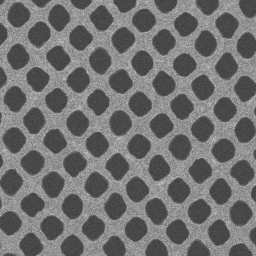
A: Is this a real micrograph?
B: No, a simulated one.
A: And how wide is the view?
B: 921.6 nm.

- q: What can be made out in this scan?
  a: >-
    a regular array of holes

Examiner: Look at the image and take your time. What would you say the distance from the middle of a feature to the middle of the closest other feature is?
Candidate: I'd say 104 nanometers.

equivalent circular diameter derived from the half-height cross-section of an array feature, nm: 82.2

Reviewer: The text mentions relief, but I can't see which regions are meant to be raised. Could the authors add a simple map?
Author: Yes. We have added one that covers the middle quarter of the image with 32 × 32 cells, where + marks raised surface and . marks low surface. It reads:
.++++++.....+++++.....+++++.....
+++..++....+++.+++....++++++....
+.....+++.++....+++..++...++....
+.....+++++......++++++....+++++
+.....+++++......+++++......++++
+.....+++++......+++++......++++
++...+++.+++....+++++++.....++++
.++++++...++++++++..++++...++.++
.+++++.....++++++....++++++....+
.+++++.....+++++......+++++.....
++++++.....+++++......+++++.....
+++++++....++++++.....+++++.....
++...+++.+++....++..++++.+++...+
+.....+++++.....++++++....++...+
+.....+++++......+++++.....+++++
+.....++++++.....++++......+++++
+.....++++++....++++++.....+++++
++...++...+++..++++++++...++++++
++++++....+++++++...+++..++....+
.++++......+++++.....++++++....+
.++++......+++++......++++......
++++++.....+++++.....+++++......
++..+++...+++.+++....++++++....+
.....+++++++...+++..++...+++..++
......+++++.....++++++....++++++
.....+++++......+++++.....++++++
.....++++++.....+++++......++++.
+...+++..+++...+++++++....+++++.
++++++....++..+++..+++...+++.+++
++++++.....+++++....+++++++...++
+++++......+++++.....+++++.....+
+++++......++++......+++++......